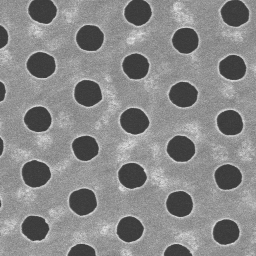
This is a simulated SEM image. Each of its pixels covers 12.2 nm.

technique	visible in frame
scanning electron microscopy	a regular array of holes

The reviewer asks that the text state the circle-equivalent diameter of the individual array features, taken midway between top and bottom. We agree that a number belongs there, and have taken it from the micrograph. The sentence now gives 326 nm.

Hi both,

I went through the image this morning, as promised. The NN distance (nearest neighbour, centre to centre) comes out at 659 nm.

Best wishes